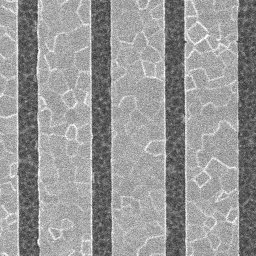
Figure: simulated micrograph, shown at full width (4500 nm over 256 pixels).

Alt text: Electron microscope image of one or a few lines or trenches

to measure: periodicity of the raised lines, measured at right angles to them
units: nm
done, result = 1290